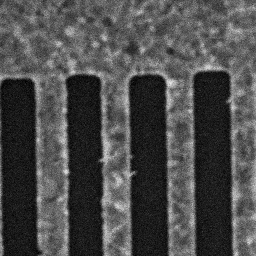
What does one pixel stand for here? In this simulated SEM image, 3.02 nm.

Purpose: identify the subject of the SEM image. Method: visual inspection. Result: one or a few lines or trenches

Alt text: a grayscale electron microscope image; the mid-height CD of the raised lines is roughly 76.5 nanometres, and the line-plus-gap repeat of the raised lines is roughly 194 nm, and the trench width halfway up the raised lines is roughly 0.119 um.